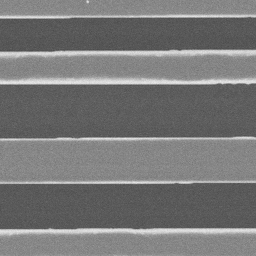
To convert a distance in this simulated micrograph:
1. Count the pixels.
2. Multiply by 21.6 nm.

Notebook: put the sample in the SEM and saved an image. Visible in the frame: lines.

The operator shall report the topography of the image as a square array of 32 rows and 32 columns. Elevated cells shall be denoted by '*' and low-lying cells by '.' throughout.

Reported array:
********************************
********************************
................................
................................
................................
................................
............********************
********************************
********************************
********************************
................................
................................
................................
................................
................................
................................
................................
********************************
********************************
********************************
********************************
********************************
********************************
................................
................................
................................
................................
................................
................................
********************************
********************************
********************************